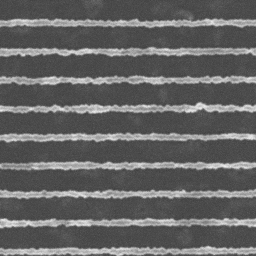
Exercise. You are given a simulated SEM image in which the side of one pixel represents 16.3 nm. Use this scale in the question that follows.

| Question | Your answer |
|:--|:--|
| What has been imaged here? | parallel lines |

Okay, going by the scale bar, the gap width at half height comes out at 392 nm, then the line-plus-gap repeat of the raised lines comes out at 465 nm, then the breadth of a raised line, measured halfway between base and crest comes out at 77.6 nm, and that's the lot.